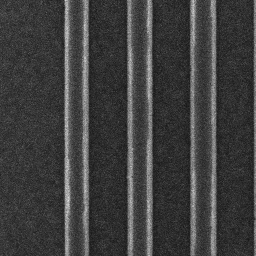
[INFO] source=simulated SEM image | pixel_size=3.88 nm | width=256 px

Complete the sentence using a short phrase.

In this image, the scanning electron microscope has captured one or a few lines or trenches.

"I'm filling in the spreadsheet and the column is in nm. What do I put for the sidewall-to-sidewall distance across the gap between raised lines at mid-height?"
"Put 163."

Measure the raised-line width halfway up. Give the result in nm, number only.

85.3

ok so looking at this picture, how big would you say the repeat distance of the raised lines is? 0.246 micrometres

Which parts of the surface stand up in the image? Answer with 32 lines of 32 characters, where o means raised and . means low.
........ooo.....ooo.....ooo.....
........ooo.....ooo.....ooo.....
........ooo.....ooo.....ooo.....
........ooo.....ooo.....ooo.....
........ooo.....ooo.....ooo.....
........ooo.....ooo.....ooo.....
........ooo.....ooo.....ooo.....
........ooo.....ooo.....ooo.....
........ooo.....ooo.....ooo.....
........ooo.....ooo.....ooo.....
........ooo.....ooo.....ooo.....
........ooo.....ooo.....ooo.....
........ooo.....ooo.....ooo.....
........ooo.....ooo.....ooo.....
........ooo.....ooo.....ooo.....
........ooo.....ooo.....ooo.....
........ooo.....ooo.....ooo.....
........ooo.....ooo.....ooo.....
........ooo.....ooo.....ooo.....
........ooo.....ooo.....ooo.....
........ooo.....ooo.....ooo.....
........ooo.....ooo.....ooo.....
........ooo.....ooo.....ooo.....
........ooo.....ooo.....ooo.....
........ooo.....ooo.....ooo.....
........ooo.....ooo.....ooo.....
........ooo.....ooo.....ooo.....
........ooo.....ooo.....ooo.....
........ooo.....ooo.....ooo.....
........ooo.....ooo.....ooo.....
........ooo.....ooo.....ooo.....
........ooo.....ooo.....ooo.....